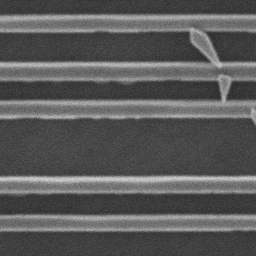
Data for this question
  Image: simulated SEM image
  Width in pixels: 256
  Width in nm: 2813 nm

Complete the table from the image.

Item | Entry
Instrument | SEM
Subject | lines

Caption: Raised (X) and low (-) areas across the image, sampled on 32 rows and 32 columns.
--------------------------------
--------------------------------
XXXXXXXXXXXXXXXXXXXXXXXXXXXXXXXX
XXXXXXXXXXXXXXXXXXXXXXXXXXXXXXXX
------------------------XX------
------------------------XX------
-------------------------XX-----
--------------------------X-----
XXXXXXXXXXXXXXXXXXXXXXXXXXXXXXXX
XXXXXXXXXXXXXXXXXXXXXXXXXXXXXXXX
---------------------------XX---
--------------------------------
--------------------------------
XXXXXXXXXXXXXXXXXXXXXXXXXXXXXXXX
XXXXXXXXXXXXXXXXXXXXXXXXXXXXXXXX
--------------------------------
--------------------------------
--------------------------------
--------------------------------
--------------------------------
--------------------------------
--------------------------------
XXXXXXXXXXXXXXXXXXXXXXXXXXXXXXXX
XXXXXXXXXXXXXXXXXXXXXXXXXXXXXXXX
--------------------------------
--------------------------------
--------------------------------
XXXXXXXXXXXXXXXXXXXXXXXXXXXXXXXX
XXXXXXXXXXXXXXXXXXXXXXXXXXXXXXXX
--------------------------------
--------------------------------
--------------------------------